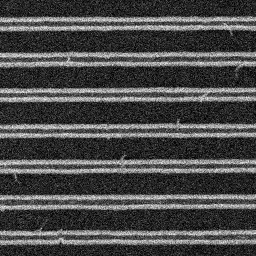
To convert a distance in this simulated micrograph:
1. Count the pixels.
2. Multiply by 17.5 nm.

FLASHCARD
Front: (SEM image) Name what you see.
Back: parallel lines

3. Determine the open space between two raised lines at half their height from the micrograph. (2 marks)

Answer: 437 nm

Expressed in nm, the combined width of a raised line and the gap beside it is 622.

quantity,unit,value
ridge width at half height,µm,0.186